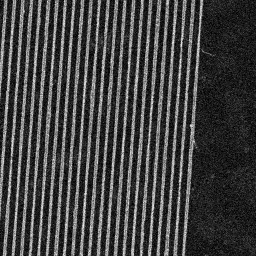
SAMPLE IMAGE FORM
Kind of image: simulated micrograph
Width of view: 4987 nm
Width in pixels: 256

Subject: parallel lines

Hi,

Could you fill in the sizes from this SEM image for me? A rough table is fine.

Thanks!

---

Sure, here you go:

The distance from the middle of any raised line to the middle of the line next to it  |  166 nm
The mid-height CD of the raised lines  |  0.0461 um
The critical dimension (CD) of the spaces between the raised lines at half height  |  6.48 px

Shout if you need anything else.